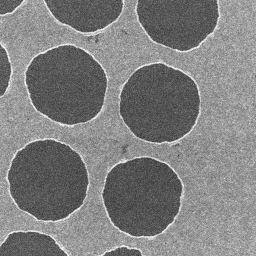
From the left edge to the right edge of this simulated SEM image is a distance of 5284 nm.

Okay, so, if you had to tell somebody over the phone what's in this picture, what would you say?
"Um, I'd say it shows holes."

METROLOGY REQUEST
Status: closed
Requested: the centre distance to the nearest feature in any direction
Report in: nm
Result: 1950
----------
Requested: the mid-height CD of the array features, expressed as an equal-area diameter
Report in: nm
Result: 1650